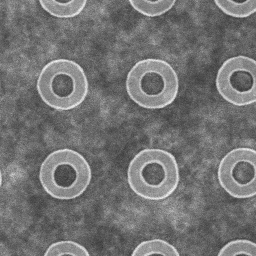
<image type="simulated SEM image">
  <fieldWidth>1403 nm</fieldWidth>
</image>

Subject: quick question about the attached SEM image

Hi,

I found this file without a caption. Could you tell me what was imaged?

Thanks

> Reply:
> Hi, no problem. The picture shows ring-shaped raised bodies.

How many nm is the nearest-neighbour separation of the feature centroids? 486